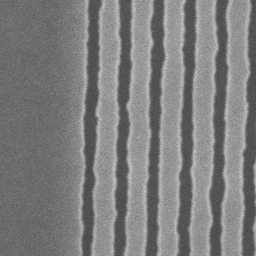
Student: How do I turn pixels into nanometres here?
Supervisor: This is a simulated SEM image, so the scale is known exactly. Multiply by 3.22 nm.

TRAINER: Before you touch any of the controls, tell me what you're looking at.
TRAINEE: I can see parallel lines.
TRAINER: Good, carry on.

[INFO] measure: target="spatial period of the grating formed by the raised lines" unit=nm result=103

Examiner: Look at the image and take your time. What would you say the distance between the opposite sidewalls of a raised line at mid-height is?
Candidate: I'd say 62.7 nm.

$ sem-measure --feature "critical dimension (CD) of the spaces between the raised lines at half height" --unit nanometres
39